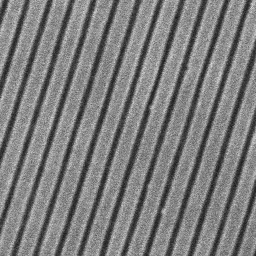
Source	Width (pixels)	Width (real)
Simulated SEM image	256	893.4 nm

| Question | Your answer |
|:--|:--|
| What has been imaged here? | parallel lines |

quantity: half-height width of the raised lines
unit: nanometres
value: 51.5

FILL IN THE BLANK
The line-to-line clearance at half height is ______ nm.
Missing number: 22.5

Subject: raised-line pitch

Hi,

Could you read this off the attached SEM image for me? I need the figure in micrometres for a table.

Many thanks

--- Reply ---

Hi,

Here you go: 0.0735